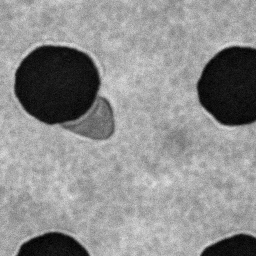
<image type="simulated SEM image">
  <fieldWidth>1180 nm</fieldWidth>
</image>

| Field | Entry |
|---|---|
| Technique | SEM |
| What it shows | holes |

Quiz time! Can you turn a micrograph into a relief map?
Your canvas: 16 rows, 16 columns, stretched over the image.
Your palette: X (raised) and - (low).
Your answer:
XXXXXXXXXXXXXXXX
XXXXXXXXXXXXXXXX
XXXXXXXXXXXXXXXX
XX---XXXXXXXX---
X-----XXXXXXX---
X-----XXXXXX----
X-----XXXXXXX---
XX---XXXXXXXXX--
XXXXXXXXXXXXXXXX
XXXXXXXXXXXXXXXX
XXXXXXXXXXXXXXXX
XXXXXXXXXXXXXXXX
XXXXXXXXXXXXXXXX
XXXXXXXXXXXXXXXX
XXXXXXXXXXXXXXXX
X----XXXXXXXX---